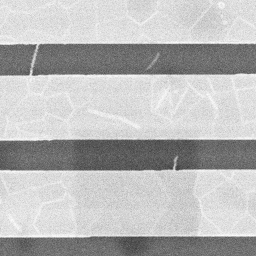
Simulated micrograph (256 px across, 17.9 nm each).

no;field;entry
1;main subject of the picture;lines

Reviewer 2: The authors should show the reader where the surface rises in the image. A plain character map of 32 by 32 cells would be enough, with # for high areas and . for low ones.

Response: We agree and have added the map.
################################
################################
################################
################################
################################
....#...........................
................................
................................
................................
...#.###########################
################################
################################
################################
################################
################################
################################
################################
................................
................................
................................
................................
################################
################################
################################
################################
################################
################################
################################
################################
############....................
................................
................................